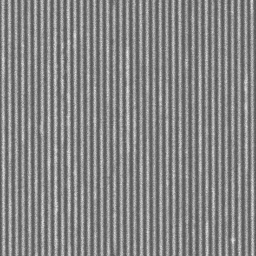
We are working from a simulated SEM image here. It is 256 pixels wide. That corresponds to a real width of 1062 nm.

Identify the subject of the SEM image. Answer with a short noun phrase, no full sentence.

parallel lines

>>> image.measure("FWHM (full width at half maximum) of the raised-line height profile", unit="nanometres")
11.4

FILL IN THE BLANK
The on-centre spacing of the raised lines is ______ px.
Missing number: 6.55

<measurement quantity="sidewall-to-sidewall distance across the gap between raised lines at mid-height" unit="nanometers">15.6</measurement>